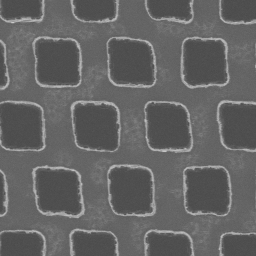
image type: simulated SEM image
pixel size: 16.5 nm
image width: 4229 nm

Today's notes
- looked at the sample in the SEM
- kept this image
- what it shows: a regular array of raised bodies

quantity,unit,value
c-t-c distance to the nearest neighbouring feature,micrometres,1.2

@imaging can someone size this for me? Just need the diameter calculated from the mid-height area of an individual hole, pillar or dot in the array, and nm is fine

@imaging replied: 858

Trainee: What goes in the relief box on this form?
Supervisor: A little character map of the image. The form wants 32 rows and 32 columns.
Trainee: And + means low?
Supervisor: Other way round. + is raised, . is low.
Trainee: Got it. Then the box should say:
+++++....++++++...++++++....++++
+++++....++++++...++++++....++++
.++++.....++++........++....++++
................................
................................
....++++++...++++++....+++++....
+...++++++...++++++....+++++....
+...++++++....+++++....+++++....
+...++++++....+++++....+++++....
+...++++++....+++++....+++++....
+....+++++....+++++....+++++....
................................
................................
+++++....++++++...+++++....+++++
+++++....++++++...++++++...+++++
+++++....++++++...++++++...+++++
+++++....++++++...++++++....++++
+++++....++++++...++++++....++++
.++++.....+++++....+++++....++++
................................
................................
....+++++.....+++++....+++++....
+...++++++...++++++....++++++...
+...++++++....+++++....++++++...
+...++++++....+++++....++++++...
+....+++++....+++++....++++++...
+....+++++....+++++.....+++++...
................................
................................
+++++....+++++....++++++....++++
++++++...++++++...++++++....++++
++++++...++++++...++++++....++++